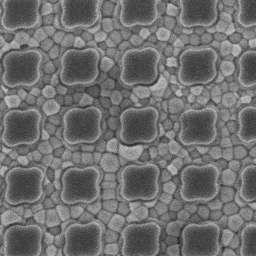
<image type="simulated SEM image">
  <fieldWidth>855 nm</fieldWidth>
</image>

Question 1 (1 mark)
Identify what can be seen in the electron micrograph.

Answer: a regular array of raised bodies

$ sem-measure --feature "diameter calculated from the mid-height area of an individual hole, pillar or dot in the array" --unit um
0.131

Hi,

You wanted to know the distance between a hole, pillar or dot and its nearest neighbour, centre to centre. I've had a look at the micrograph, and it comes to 190 nm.